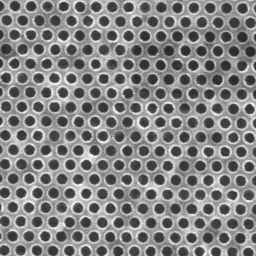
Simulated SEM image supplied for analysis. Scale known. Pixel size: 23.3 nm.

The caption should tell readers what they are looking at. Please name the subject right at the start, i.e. a regular array of holes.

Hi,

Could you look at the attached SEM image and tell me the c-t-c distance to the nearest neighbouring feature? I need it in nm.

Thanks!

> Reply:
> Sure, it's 376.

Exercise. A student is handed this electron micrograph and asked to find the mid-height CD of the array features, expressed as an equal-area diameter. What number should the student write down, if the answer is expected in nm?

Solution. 264